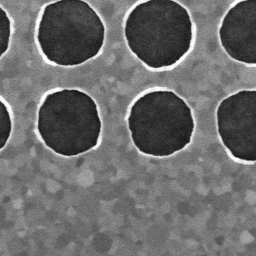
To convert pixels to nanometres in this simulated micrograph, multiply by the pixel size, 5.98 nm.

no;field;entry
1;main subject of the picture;holes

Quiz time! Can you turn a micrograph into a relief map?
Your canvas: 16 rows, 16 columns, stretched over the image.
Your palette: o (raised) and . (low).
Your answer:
ooo..ooo...ooo..
.o....oo....oo..
.o....oo....oo..
ooo...ooo..ooo..
oooooooooooooooo
oooooooooooooooo
ooo...ooo...oo..
.o....oo....oo..
.oo...oo....oo..
ooo..oooo..ooo..
oooooooooooooooo
oooooooooooooooo
oooooooooooooooo
oooooooooooooooo
oooooooooooooooo
oooooooooooooooo